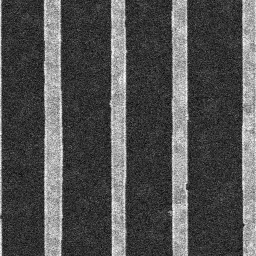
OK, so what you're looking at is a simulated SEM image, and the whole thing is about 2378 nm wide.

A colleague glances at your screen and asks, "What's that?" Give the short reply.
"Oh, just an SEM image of one or a few lines or trenches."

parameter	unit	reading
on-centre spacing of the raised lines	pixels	63.4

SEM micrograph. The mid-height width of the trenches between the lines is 457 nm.